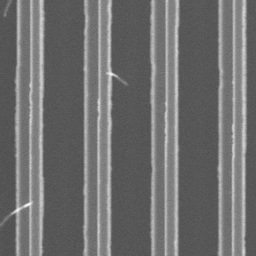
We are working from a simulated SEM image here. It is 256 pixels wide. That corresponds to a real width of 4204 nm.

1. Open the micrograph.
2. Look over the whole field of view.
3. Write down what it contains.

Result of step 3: lines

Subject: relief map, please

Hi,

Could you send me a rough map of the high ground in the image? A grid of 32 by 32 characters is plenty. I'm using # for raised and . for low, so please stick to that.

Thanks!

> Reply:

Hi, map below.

..###......###.....###......###.
..###......###.....###......###.
..###......###.....###......##..
..###......###.....###......##..
..###......###.....###......###.
..###......###.....###......###.
..###......###.....###......###.
..###......###.....###......##..
..###......###.....###......##..
..###......###.....###......##..
..###......###.....###......##..
..###......###.....###......##..
..###......###.....###......###.
..###......###.....###......###.
..###......###.....###......###.
..###......###.....###......###.
..###......###.....###......##..
..###......###.....###......##..
..###......###.....###......##..
..###......###.....###......##..
..###......###.....###......##..
..###......###.....###......##..
..###......###.....###......##..
..###......###.....###......##..
..###......###.....###......##..
..###......###.....###......##..
..###......###.....###......##..
..###......###.....###......##..
..###......###.....###......##..
..###......###.....###......##..
..###......###.....###......##..
..###......###.....###......##..